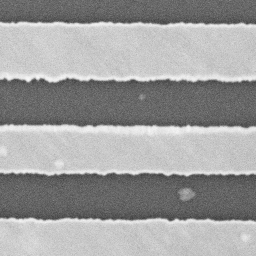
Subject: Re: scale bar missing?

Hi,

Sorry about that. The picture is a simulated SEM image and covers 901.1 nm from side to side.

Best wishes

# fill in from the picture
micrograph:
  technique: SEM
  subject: lines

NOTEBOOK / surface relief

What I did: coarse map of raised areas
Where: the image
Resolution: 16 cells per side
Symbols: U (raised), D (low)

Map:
DDDDDDDDDDDDDDDD
UUUUUUUUUDDUDDDD
UUUUUUUUUUUUUUUU
UUUUUUUUUUUUUUUU
UUUUUUUUUUUUUUUU
DDDDDDDDDDDDDDDD
DDDDDDDDDDDDDDDD
DDDDDDDDDDDDDDDD
UUUUUUUUUUUUUUUU
UUUUUUUUUUUUUUUU
UUUUUUUUUUUUUUUU
DDDDDDDDDDDDDDDD
DDDDDDDDDDDDDDDD
DDDDDDDDDDDDDDDD
UUUUUUUUUUUUUUUU
UUUUUUUUUUUUUUUU